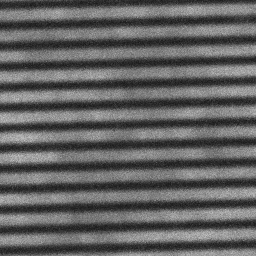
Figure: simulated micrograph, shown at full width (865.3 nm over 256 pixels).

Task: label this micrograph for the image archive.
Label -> parallel lines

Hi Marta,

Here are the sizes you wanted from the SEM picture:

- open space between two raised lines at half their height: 39.3 nm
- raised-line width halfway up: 30.4 nanometres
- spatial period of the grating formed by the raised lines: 69.2 nanometers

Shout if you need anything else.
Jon